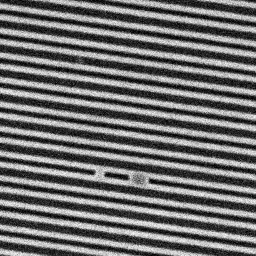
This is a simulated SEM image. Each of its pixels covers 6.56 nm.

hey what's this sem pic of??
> parallel lines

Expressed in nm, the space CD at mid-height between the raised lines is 51.2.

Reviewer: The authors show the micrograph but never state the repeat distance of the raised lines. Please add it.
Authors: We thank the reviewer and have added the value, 79.5 nanometers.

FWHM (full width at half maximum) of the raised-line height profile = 31.6 nm